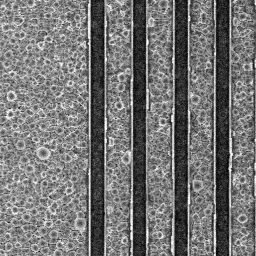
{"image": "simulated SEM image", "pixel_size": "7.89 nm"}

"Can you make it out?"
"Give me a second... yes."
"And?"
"parallel lines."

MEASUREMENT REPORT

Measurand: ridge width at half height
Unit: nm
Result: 219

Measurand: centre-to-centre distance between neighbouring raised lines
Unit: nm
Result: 326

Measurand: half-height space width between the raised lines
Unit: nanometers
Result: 109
